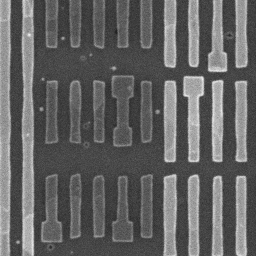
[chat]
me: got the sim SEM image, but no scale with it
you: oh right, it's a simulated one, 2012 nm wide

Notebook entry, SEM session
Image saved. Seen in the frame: wiring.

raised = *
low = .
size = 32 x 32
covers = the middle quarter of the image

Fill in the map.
..........................**....
................................
................................
............*****.............**
..**...***..*****...**...***..**
..**...***..*****..***...***..**
..**...***..*****...**...***..**
..**...***..*****...**...***..**
..**...***...***....**...***...*
..**...***...***...***...***...*
..**...***...***...***...***...*
..**...***...***...***...***...*
..**....**...***...***...***...*
..**....**...***...***...***...*
..**....**...***...***...***...*
..**....**...***...***...***...*
..**....**...****..***...***...*
..**....**..*****..***...***...*
..**....**..*****...**...***...*
..**....**..*****...*....***...*
.........................***...*
.........................***...*
.........................***...*
.........................***...*
................................
................................
................................
................................
..**....**....**...***...***...*
..**...***....**...***...***...*
..**...***....**....**...***...*
..**...***....**....**...***...*